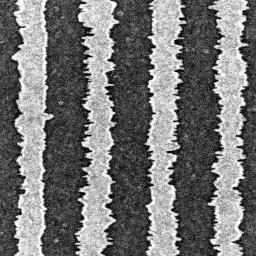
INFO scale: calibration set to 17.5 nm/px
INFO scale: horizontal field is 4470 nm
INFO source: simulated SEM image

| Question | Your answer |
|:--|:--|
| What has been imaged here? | one or a few lines or trenches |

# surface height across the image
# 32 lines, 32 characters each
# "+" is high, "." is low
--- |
...++.....++++.....++++....++++.
..+++.....++++.....++++....+++..
..+++.....++++.....++++....+++..
...++......+++.....+++.....+++..
...+++.....+++.....+++......++..
...+++.....+++.....+++.....+++..
..++++.....+++.....+++......++..
..++++.....+++.....+++.....+++..
...+++.....+++.....+++.....++++.
...+++.....++......+++.....++++.
...+++.....++......+++.....++++.
...+++.....++......+++.....+++..
..++++.....+++.....+++......++..
..++++.....+++.....+++......++..
...+++.....+++.....+++......++..
..+++......+++.....+++......++..
...++......+++.....+++.....+++..
...++......+++.....+++......++..
...++......+++.....+++......++..
...++......+++.....+++.....+++..
..+++......+++.....++......+++..
...++......++......++......+++..
...++......+++.....++......+++..
...++.....++++.....+++.....++...
...++......+++.....+++.....+++..
..+++.....+++......++......+++..
...++.....++++.....+++.....+++..
..+++......+++.....+++.....+++..
..+++.....+++......+++.....+++..
..+++.....+++......+++.....+++..
..+++.....+++......+++.....+++..
..+++.....+++......+++.....+++..